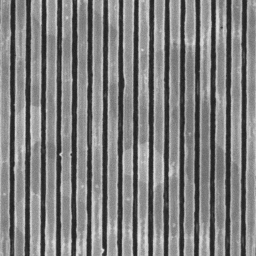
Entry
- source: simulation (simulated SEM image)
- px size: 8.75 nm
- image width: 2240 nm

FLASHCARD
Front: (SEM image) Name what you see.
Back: parallel lines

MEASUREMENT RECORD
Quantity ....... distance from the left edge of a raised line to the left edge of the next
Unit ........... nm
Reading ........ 135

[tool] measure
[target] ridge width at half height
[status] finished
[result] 84.3 nanometers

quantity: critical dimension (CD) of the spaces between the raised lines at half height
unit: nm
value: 46